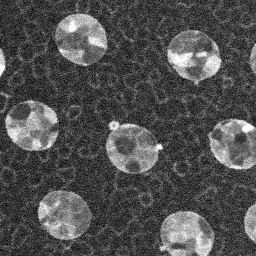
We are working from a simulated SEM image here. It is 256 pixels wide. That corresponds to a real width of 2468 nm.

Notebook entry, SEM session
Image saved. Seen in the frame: raised bodies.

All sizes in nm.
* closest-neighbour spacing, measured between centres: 916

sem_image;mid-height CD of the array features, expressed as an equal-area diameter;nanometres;490